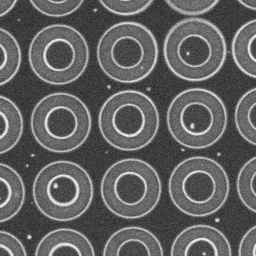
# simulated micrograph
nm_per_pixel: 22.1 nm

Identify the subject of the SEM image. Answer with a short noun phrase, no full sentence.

an array of small figures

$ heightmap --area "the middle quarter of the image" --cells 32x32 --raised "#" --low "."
#....####.....####....####......
.....#####............#####.....
....#######..........#######....
...##########.......##########..
.###############.###############
################################
################################
##############.....##########...
...#########.........#######....
....#######...........#####.....
.....#####.....###.....####....#
#.....###....######....###....##
##....###....#######...###...###
###...###...########...###...###
###...###...########...###...###
###...###....#######...###....##
###...###....######....####...##
##....####.....###....#####.....
.....#####............######....
....#######..........########...
...##########......############.
..##############################
################################
################################
.#############......##########..
...##########........########...
.....######...........######....
......#####....###.....####.....
##....####....######...####....#
###....###...#######....##....##
###....###...#######....###...##
###....###...#######....###...##